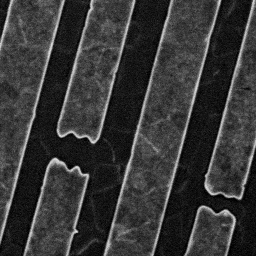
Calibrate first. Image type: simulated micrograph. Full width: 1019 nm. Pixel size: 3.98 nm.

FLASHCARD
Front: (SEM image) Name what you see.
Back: one or a few lines or trenches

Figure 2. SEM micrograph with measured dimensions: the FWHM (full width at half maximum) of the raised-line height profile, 170 nanometres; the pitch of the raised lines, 310 nm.